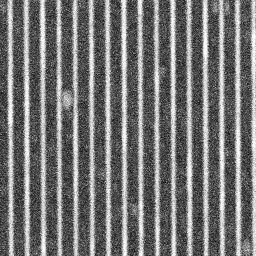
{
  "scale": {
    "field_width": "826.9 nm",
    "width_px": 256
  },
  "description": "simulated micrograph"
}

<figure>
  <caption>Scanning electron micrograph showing parallel lines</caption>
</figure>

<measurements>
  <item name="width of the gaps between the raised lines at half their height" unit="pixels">13.4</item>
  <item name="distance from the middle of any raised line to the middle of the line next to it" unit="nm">52.4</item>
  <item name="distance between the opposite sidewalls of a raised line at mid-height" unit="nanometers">9.3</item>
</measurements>